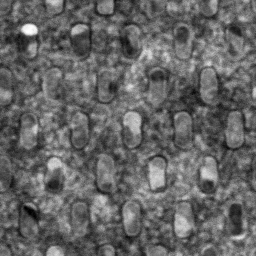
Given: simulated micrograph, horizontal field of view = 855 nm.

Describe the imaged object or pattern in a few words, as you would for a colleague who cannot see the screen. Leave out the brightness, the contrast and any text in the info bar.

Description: a regular array of raised bodies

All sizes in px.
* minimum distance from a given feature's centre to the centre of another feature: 49.4